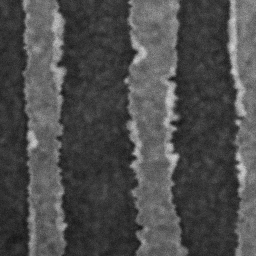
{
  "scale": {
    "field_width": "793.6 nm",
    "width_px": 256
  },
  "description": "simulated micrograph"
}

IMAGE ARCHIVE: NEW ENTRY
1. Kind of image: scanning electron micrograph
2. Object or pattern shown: one or a few lines or trenches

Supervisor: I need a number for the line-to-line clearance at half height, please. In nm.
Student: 208